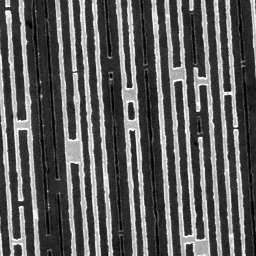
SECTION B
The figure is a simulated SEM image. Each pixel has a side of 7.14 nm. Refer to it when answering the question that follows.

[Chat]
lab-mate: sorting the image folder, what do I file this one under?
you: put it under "parallel lines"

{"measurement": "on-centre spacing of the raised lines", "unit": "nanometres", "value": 86.7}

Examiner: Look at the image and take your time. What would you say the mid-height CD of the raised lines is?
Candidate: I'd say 3.99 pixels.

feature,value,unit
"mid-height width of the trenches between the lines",61.4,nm